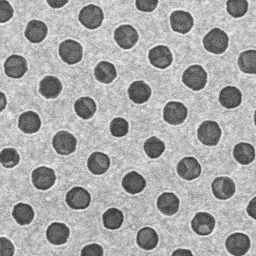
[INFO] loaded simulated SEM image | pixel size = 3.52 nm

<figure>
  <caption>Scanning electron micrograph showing a regular array of holes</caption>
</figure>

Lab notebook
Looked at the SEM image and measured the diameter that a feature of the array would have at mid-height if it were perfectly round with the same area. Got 87.3 nm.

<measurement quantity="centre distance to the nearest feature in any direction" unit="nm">141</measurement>